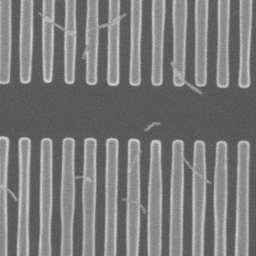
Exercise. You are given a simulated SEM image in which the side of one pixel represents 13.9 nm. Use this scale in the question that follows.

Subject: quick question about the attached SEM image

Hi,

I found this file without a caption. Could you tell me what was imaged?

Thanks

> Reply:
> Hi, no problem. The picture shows groups of lines, slits or small figures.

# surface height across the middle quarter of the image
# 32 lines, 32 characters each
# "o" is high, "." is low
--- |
oo....oo...ooo...oo...oo...ooo..
oo....oo...ooo...oo...oo...ooo..
oo....oo...ooo...oo...oo....oo..
oo....oo...ooo...oo...oo....oo..
.o....oo...ooo...oo...oo....ooo.
................................
................................
................................
................................
................................
................................
................................
................................
................................
................................
................................
................................
................................
................................
oo...ooo...oo...ooo...oo...ooo..
oo...ooo...oo...ooo...oo...ooo..
oo...ooo...oo...ooo...oo...ooo..
oo...ooo...oo...ooo...oo...ooo..
oo...ooo...oo...ooo...oo...ooo..
oo...ooo...oo...ooo...oo...ooo..
oo...ooo...oo...ooo...oo...ooo..
oo...ooo...oo...ooo...oo...ooo..
oo...ooo...oo...ooo...oo...ooo..
ooo.oooo...oo...ooo..ooo...ooo..
oo...ooo...oo...ooo..ooo...ooo..
oo...ooo...oo...ooo..ooo...ooo..
oo...ooo...oo...ooo..ooo...ooo..